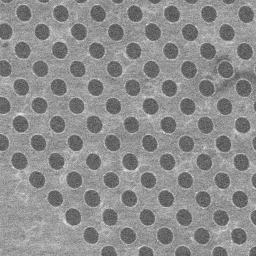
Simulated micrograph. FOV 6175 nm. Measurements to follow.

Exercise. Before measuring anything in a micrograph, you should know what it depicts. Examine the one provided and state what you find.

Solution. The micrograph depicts a regular array of raised bodies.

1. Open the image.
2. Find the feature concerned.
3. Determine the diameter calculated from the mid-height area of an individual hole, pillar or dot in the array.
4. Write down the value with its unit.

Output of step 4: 0.42 um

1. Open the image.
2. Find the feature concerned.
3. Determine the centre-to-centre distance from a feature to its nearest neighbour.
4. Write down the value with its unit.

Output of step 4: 620 nanometres